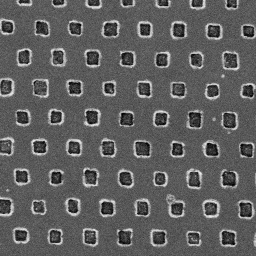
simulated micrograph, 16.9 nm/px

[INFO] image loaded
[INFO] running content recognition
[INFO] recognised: a regular array of holes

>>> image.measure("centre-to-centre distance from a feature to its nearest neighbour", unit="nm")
567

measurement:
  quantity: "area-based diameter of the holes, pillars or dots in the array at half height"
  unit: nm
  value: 246